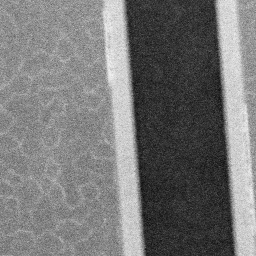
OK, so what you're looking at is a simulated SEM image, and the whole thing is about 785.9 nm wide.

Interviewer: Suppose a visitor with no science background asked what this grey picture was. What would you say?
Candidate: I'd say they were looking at one or a few lines or trenches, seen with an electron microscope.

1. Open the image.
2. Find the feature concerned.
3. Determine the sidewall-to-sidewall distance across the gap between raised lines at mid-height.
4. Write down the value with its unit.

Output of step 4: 0.347 micrometres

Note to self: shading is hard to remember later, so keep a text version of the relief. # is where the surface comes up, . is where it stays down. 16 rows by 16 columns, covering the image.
#######.......##
#######.......##
#######.......##
#######.......##
#######........#
#######........#
########.......#
########.......#
########.......#
########.......#
########.......#
########.......#
########.......#
########.......#
########.......#
########.......#